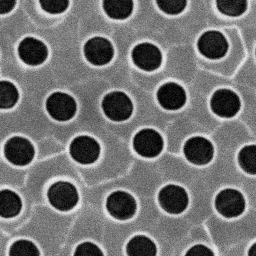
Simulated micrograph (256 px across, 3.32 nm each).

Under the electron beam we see a regular array of holes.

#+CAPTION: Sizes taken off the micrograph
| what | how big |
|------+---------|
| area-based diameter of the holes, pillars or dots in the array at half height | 103 nanometers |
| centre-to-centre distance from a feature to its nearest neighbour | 170 nanometres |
